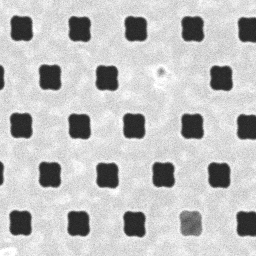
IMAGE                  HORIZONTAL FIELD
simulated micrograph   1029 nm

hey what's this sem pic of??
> a regular array of holes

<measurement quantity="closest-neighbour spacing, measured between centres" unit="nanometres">225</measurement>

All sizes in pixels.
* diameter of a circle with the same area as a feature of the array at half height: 24.8